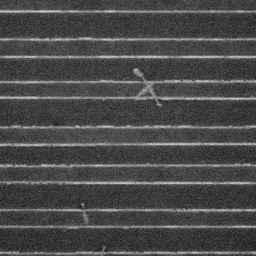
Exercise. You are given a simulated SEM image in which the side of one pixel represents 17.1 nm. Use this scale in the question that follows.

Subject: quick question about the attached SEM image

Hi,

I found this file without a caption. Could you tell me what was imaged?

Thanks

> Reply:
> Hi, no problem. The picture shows lines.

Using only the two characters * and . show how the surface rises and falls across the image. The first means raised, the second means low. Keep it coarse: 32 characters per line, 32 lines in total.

********************************
................................
................................
................................
................................
********************************
********************************
................................
................................
................................
********************************
********************************
................................
................................
................................
................................
********************************
********************************
................................
................................
................................
********************************
********************************
................................
................................
................................
********************************
********************************
................................
................................
................................
............**..................